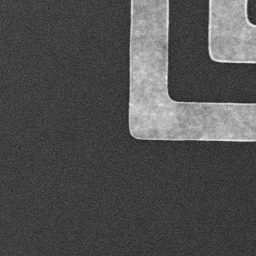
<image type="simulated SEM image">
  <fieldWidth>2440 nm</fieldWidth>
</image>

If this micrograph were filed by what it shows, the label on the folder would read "groups of lines, slits or small figures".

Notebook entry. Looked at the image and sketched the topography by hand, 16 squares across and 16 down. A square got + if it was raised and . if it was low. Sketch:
........++...++.
........++...+++
........++...+++
........++...+++
........++......
........++......
........++++++..
........++++++++
........++++++++
................
................
................
................
................
................
................